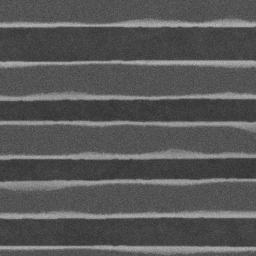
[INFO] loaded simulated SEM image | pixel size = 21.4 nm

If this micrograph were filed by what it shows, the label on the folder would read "lines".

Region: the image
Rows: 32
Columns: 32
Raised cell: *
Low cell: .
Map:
********************************
********************************
********************************
................................
................................
................................
................................
................................
********************************
********************************
********************************
********************************
................................
................................
................................
*******************************.
********************************
********************************
********************************
*********************..*********
................................
................................
..............................*.
********************************
********************************
********************************
********************************
................................
................................
................................
................................
********************************